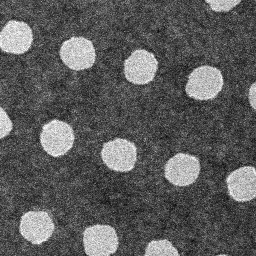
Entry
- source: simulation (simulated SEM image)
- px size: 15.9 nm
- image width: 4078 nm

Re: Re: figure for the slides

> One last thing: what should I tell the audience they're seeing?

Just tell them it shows raised bodies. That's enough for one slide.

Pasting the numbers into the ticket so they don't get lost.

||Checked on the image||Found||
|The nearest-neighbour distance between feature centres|1.03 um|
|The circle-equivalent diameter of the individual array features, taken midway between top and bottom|526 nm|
